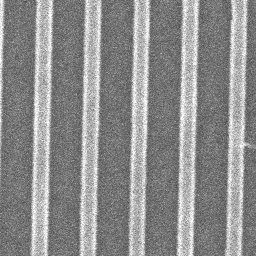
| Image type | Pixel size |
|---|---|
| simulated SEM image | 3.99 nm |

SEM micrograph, parallel lines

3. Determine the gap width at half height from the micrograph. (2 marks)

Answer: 142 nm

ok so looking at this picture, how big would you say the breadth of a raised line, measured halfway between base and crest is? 51.8 nm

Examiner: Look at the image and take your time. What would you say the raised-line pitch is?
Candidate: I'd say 194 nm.